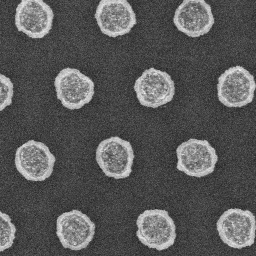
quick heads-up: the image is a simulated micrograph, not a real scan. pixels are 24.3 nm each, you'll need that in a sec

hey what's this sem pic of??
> a regular array of raised bodies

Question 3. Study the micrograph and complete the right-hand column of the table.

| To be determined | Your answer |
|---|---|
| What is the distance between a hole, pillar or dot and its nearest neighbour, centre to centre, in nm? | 1950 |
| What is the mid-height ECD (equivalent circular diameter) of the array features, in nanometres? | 864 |